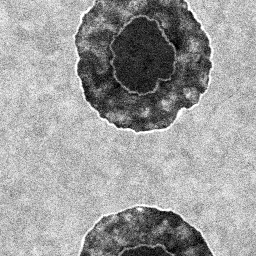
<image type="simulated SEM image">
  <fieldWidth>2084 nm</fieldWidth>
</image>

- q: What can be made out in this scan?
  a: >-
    ring-shaped grooves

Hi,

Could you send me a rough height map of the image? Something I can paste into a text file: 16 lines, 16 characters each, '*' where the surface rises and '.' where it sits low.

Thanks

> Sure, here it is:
******......****
*****...**...***
*****..***...***
*****..****..***
*****..****..***
*****...**...***
******......****
*******....*****
****************
****************
****************
****************
****************
*******....*****
******......****
*****...**...***